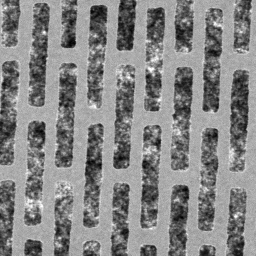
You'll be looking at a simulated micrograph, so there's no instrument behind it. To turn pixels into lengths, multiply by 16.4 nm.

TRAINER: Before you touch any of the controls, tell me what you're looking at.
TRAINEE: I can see a regular array of holes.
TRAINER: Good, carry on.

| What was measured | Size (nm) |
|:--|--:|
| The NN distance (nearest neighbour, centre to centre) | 946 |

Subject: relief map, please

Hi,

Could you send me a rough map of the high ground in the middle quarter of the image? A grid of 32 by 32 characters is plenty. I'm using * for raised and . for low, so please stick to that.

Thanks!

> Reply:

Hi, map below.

...***....****....**.....*******
....**....***.....**.....***....
...***....***.....**.....***....
...***....***.....**.....**.....
...***....***.....**.....**.....
...***....***.....**.....**.....
...***....***.....**.....**.....
...***....***.....**....***.....
...***....***.....**....***.....
...***....***.....**....***.....
...***...****.....**....***.....
...**********....***....***.....
...**********....**********.....
...**********....**********.....
...**********....**********.....
...***....**.....***....***.....
...***....***....***.....**.....
...***....**.....***.....**.....
...***....**.....***.....**.....
..****....**.....***....***....*
..****....**.....***....***....*
..****....**.....***....**.....*
..****....**.....**.....**.....*
..***.....**.....**.....***....*
..***.....**.....**.....***....*
..***.....**....***.....***....*
*****.....*********.....***....*
*****.....*********.....********
*****.....*********.....********
.****....**********.....********
..***....***....***.....***....*
..***....***.....**.....***....*